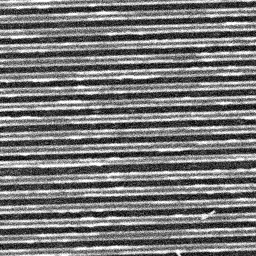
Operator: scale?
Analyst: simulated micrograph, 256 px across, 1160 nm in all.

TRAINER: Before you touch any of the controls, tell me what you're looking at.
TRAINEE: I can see parallel lines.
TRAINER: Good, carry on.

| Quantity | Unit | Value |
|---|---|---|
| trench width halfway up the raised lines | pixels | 7.11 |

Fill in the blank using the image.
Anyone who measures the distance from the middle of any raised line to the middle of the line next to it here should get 66.4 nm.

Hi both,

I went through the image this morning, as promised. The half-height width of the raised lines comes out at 32.8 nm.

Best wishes